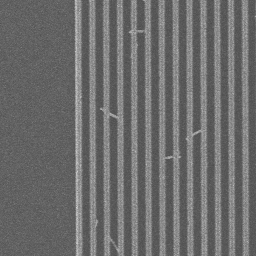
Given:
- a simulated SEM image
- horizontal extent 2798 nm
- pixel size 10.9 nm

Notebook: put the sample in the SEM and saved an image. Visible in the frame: parallel lines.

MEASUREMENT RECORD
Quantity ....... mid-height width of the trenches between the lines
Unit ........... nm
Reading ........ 105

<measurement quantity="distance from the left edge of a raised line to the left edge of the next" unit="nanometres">152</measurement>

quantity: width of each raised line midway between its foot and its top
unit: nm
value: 53.3